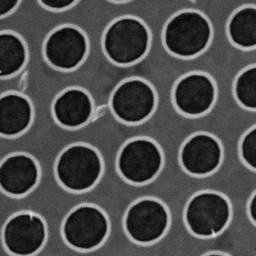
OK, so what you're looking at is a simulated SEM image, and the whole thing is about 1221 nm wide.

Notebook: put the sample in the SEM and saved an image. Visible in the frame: a regular array of holes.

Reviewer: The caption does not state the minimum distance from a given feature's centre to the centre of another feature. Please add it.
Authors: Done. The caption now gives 287 nm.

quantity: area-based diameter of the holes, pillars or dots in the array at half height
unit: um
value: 0.212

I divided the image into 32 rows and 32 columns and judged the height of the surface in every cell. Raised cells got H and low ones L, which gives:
LLHHHLLLLHHHHHHHHHHHHHHHHHHHHHHH
LHHHHHHHHHHHHHHHHHHHHHHLLHHHHHLL
HHHHHHHHHHHHHHHLLHHHHLLLLLHHHLLL
HHHHHHHLLHHHHHLLLLHHHLLLLLHHLLLL
LLHHHHLLLLLHHLLLLLLHLLLLLLHHHLLL
LLLHHHLLLLLHHLLLLLLHHLLLLLHHHLLL
LLLHHHLLLLLHHLLLLLHHHLLLLHHHHHHH
LLLHHHLLLLHHHHLLLHHHHHHHHHHHHHHH
LLLHHHHLLHHHHHHHHHHHHHHHHHHHHHHL
LHHHHHHHHHHHHHHHHHHHHHHLLLHHHHLL
HHHHHHHHHHHHHHHLLLHHHHLLLLLHHLLL
HHHHHHHHLLLHHHLLLLLHHHLLLLLHHLLL
LLLLHHHLLLLHHHLLLLLHHHLLLLLHHHLL
LLLLHHHLLLLLHHLLLLLHHHLLLLHHHHHL
LLLLHHHLLLLHHHHLLLLHHHHHHHHHHHHH
LLLLHHHHLLHHHHHHHHHHHHHHHHHHHHHH
LLLHHHHHHHHHHHHHHHHHHHHHHHHHHHHL
HHHHHHHHHHHHHHHHHLLHHHHLLLLHHHLL
HHHHHHHHHLLHHHHLLLLLHHHLLLLLHHLL
HLLLHHHLLLLLHHHLLLLLHHHLLLLLHHLL
LLLLLHHLLLLLLHHLLLLLHHHLLLLHHHHL
LLLLLHHLLLLLLHHLLLLLHHHHLLHHHHHH
LLLLLHHLLLLLHHHHLLLHHHHHHHHHHHHH
LLLLHHHHLLLHHHHHHHHHHHHHHHHHHHHH
HHHHHHHHHHHHHHHHHHHHHHHHLLLLHHHH
HHHHHHHHHHHHHHHHHLLLHHHHLLLLLHHL
HHHHHHHHHLLLLHHHLLLLLHHLLLLLLHHL
HLLLLHHHLLLLLHHHLLLLLHHLLLLLLHHH
HLLLLLHHLLLLLLHHLLLLLHHHLLLLHHHH
LLLLLLHHLLLLLHHHLLLLHHHHHLHHHHHH
HLLLLHHHHLLLLHHHHHHHHHHHHHHHHHHH
HLLLLHHHHHHHHHHHHHHHHHHHHHHHHHHH